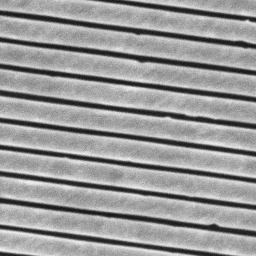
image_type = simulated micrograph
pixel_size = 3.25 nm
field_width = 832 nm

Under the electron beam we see parallel lines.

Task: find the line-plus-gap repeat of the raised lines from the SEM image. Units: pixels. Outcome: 26.5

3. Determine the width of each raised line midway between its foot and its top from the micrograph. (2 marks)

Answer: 66.4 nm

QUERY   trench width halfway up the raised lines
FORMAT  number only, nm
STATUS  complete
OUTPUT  22.1